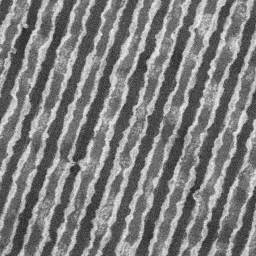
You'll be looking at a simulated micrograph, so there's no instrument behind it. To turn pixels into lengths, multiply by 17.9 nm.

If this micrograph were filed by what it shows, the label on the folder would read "parallel lines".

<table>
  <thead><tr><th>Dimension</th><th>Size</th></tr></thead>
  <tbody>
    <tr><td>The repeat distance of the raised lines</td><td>535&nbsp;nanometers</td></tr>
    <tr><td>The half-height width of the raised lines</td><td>0.264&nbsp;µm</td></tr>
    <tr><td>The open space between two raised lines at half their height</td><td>14.8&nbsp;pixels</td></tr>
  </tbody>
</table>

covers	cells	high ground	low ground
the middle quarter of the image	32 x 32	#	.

##....###....#####...####....###
##...####....####....####....###
#....####...#####....####...####
#....###....####.....####...####
.....###....####.....###.....###
....####....####....####....####
....####....####....###.....###.
....###.....###....####....####.
...####....####....####...#####.
...####....####....####...#####.
..####.....###....####....####..
.#####....####....###.....####..
..####...####.....###....####...
.####....####....####....####...
.###.....###.....####....####...
.###.....###.....####...####....
####....####....####....####...#
####....###....####.....####...#
###....####....####....####....#
###....####....####....####...##
###...#####...####....####....##
##....#####...####....####....##
##....####...####.....####....##
##....####...####....####....###
##..######...#####...####....###
#...#####....####....####...####
#...#####....###....####....####
....####....####....####....####
...#####....###.....####...#####
....###.....###....####.....###.
...####....####....####....####.
...####....####....####....###..